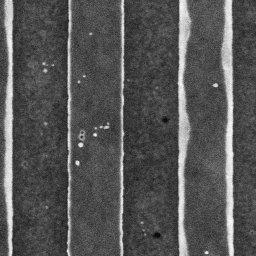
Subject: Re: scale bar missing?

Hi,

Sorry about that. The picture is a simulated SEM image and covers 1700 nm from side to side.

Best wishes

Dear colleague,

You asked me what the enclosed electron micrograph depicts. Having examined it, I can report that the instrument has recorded lines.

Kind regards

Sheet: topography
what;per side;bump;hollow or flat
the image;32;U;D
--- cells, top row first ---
UDDDDDDDDUUUUUUDDDDDDDDUUUUUUDDD
UDDDDDDDDUUUUUUDDDDDDDDUUUUUUDDD
UDDDDDDDDUUUUUUDDDDDDDDUUUUUUDDD
UDDDDDDDDUUUUUUDDDDDDDDUUUUUUDDD
UDDDDDDDDUUUUUUDDDDDDDDUUUUUUDDD
UDDDDDDDDUUUUUUDDDDDDDDUUUUUUDDD
UDDDDDDDDUUUUUUDDDDDDDDUUUUUDDDD
UDDDDDDDDUUUUUUDDDDDDDDUUUUUDDDD
UDDDDDDDDUUUUUUDDDDDDDDUUUUUUDDD
UDDDDDDDDUUUUUUDDDDDDDUUUUUUUDDD
UDDDDDDDDUUUUUUDDDDDDDUUUUUUUDDD
UDDDDDDDDUUUUUUDDDDDDDDUUUUUUDDD
UDDDDDDDDUUUUUUDDDDDDDDUUUUUUDDD
UDDDDDDDDUUUUUUDDDDDDDDUUUUUUDDD
UDDDDDDDDUUUUUUDDDDDDDDUUUUUUDDD
UDDDDDDDDUUUUUUDDDDDDDDUUUUUUDDD
UDDDDDDDDUUUUUUDDDDDDDDUUUUUUDDD
UDDDDDDDDUUUUUUDDDDDDDDUUUUUUDDD
UDDDDDDDDUUUUUUDDDDDDDDUUUUUUDDD
UDDDDDDDDUUUUUUDDDDDDDDUUUUUUDDD
UDDDDDDDDUUUUUUDDDDDDDDUUUUUUDDD
UDDDDDDDDUUUUUUDDDDDDDDUUUUUUDDD
UDDDDDDDDUUUUUUDDDDDDDDUUUUUUDDD
UDDDDDDDDUUUUUUDDDDDDDDUUUUUUDDD
UDDDDDDDDUUUUUUDDDDDDDDUUUUUUDDD
UDDDDDDDDUUUUUUDDDDDDDDUUUUUUDDD
UDDDDDDDDUUUUUUDDDDDDDDUUUUUUDDD
UDDDDDDDDUUUUUUDDDDDDDDUUUUUUDDD
UDDDDDDDDUUUUUUDDDDDDDDUUUUUUDDD
UDDDDDDDDUUUUUUDDDDDDDDUUUUUUDDD
UDDDDDDDDUUUUUUDDDDDDDDUUUUUUDDD
UDDDDDDDDUUUUUUDDDDDDDDUUUUUUDDD